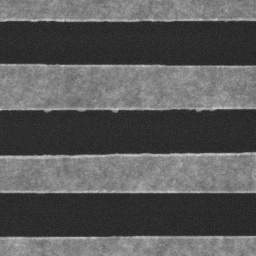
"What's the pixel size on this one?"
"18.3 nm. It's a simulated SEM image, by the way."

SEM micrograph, lines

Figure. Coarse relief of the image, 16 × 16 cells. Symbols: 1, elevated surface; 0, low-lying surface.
1111111111111111
0000000000000000
0000000000000000
0000000000000000
1111111111111111
1111111111111111
1111111111111111
0000000000000000
0000000000000000
0000000000000000
1111111111111111
1111111111111111
0000000000000000
0000000000000000
0000000000000000
1111111111111111